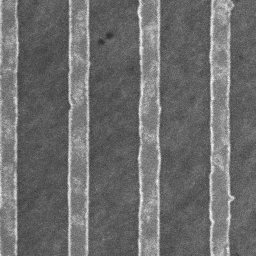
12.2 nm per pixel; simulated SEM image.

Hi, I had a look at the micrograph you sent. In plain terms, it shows one or a few lines or trenches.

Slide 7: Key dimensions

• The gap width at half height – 640 nm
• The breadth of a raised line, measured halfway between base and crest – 218 nanometers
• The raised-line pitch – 861 nm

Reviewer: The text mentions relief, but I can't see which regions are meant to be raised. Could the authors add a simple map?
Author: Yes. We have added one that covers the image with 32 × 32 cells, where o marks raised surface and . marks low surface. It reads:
oo.......oo......ooo.......oo...
oo.......oo......ooo.......oo...
oo.......oo......ooo.......oo...
oo.......oo.......oo......ooo...
oo.......oo.......oo......ooo...
oo.......oo.......oo.......oo...
oo.......oo.......oo......ooo...
oo.......oo.......oo......ooo...
oo.......oo.......oo.......oo...
oo.......oo.......oo......ooo...
oo.......oo.......oo......ooo...
oo.......oo.......oo......ooo...
oo.......oo.......oo......oo....
oo.......oo......ooo......ooo...
oo.......oo......ooo......ooo...
oo.......oo.......oo......ooo...
oo.......oo.......oo......ooo...
oo.......oo.......oo......ooo...
oo.......oo.......oo.......oo...
oo.......oo......ooo......ooo...
oo.......oo......ooo......ooo...
oo.......oo......ooo......ooo...
oo.......oo.......oo......ooo...
oo.......oo.......oo......ooo...
oo.......oo.......oo......ooo...
oo.......oo.......oo......ooo...
oo.......oo......ooo......ooo...
oo.......oo......ooo......ooo...
oo.......oo.......oo......ooo...
oo.......oo......ooo......oo....
oo.......oo......ooo......ooo...
oo.......oo.......oo......ooo...